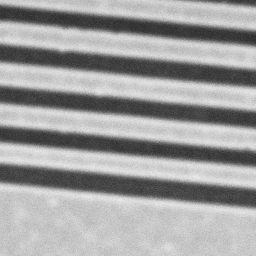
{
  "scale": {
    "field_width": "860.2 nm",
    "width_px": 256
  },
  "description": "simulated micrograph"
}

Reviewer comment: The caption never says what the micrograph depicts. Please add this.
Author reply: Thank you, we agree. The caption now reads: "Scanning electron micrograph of parallel lines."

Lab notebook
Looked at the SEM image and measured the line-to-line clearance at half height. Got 65.2 nm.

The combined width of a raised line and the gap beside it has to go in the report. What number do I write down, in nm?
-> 134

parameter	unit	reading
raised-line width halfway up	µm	0.0686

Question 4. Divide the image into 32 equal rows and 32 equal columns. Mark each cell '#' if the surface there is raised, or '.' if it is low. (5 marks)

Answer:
###########################.....
..........######################
....................############
#######.......................##
##################..............
.###########################....
...........#####################
.......................#########
#####...........................
################................
##########################......
.........#######################
...................#############
####.........................###
################................
#########################.......
.........#######################
...................#############
######.......................###
################................
...########################.....
.............###################
.......................#########
#####...........................
###############.................
#########################.......
################################
################################
################################
################################
################################
################################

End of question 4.